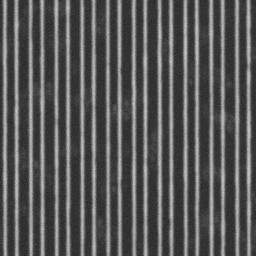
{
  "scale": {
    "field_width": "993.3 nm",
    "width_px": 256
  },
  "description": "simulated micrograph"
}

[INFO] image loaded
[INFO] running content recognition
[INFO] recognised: parallel lines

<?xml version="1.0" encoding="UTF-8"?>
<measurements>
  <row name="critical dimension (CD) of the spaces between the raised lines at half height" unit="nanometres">33.4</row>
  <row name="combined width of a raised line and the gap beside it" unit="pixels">12.8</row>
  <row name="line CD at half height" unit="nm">11.1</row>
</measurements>